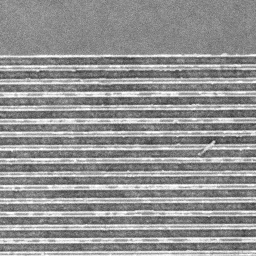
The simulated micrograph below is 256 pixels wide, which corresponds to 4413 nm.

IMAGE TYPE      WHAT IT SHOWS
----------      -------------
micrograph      parallel lines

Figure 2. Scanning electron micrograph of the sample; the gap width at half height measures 168 nm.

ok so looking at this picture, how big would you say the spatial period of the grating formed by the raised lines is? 229 nm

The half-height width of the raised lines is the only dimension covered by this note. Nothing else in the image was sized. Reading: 69 nm